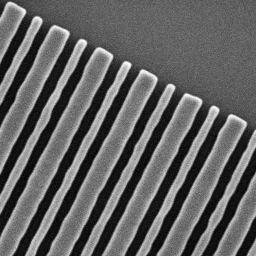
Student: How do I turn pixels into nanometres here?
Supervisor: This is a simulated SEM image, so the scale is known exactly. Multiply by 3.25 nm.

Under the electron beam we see groups of lines, slits or small figures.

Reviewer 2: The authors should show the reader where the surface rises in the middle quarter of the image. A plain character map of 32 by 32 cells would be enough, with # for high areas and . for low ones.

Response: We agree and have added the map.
.##..######...###...............
##...######...##................
##...#####...###...###..........
#...######...##...#####.........
#...#####....##...#####.........
...######...##...######...#.....
...#####...###..######...##.....
..######...##...######...##.....
..#####...###...#####...###...##
.######...##...######...##...###
.#####...###...#####...###..####
######...##...######...##...####
#####...###...#####...###..#####
#####...##...######..###...#####
####...###...#####...###...#####
####...##...######...##...######
###...###...#####...##...######.
###...##...######...##...#####..
##...###...#####...##...######..
##...##...######..###...#####...
#...###..######...##...######...
#...##...######...##...#####...#
...##...######...##...######...#
...##...######...##...#####...##
..##...######...##...######...##
..##...######...##...######..###
.##...######...###..######...##.
###...######..###...#####...###.
###..######...###..######...##..
##...######...##...#####...###..
##..######...##...######...##...
#...#####...###...#####...###...